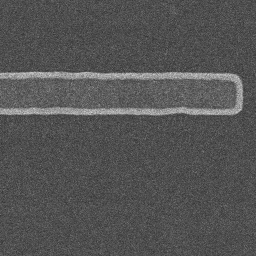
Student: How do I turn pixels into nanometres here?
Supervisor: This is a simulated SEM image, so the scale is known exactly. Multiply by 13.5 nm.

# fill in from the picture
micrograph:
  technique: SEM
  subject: one or a few lines or trenches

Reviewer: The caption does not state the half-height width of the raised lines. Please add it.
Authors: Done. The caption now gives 489 nm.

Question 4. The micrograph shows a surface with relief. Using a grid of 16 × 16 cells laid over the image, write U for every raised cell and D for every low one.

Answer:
DDDDDDDDDDDDDDDD
DDDDDDDDDDDDDDDD
DDDDDDDDDDDDDDDD
DDDDDDDDDDDDDDDD
DDDDDDDDDDDDDDDD
UUUUUUUUUUUUUUUD
UUUUUUUUUUUUUUUD
DDDDDDDDDDDDDDDD
DDDDDDDDDDDDDDDD
DDDDDDDDDDDDDDDD
DDDDDDDDDDDDDDDD
DDDDDDDDDDDDDDDD
DDDDDDDDDDDDDDDD
DDDDDDDDDDDDDDDD
DDDDDDDDDDDDDDDD
DDDDDDDDDDDDDDDD